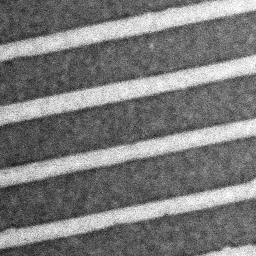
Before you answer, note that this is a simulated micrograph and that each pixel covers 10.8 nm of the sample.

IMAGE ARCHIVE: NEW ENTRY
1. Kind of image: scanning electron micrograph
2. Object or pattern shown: one or a few lines or trenches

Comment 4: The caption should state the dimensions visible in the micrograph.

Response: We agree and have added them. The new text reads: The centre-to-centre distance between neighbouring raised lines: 662 nanometres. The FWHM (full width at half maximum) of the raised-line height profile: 0.16 um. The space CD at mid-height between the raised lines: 501 nm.